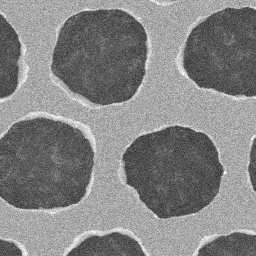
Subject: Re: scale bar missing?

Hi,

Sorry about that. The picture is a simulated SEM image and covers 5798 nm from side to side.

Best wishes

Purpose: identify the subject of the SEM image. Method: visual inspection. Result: holes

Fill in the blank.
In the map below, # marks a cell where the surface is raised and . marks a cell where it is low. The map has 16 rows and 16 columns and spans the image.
##############..
.###.....###....
.###.....###....
.##......##.....
.##......###....
.###.....####...
#####..#########
#...############
.....####....###
......##......##
......##......##
......##......##
.....####....###
##########.#####
################
.####....####...